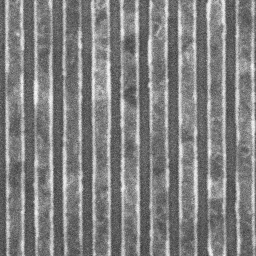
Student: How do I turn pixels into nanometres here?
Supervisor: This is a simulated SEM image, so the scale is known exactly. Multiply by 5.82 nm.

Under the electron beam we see parallel lines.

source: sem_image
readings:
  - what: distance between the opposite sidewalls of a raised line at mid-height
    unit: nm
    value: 102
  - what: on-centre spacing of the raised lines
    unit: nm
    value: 168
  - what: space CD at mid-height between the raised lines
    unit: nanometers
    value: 64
